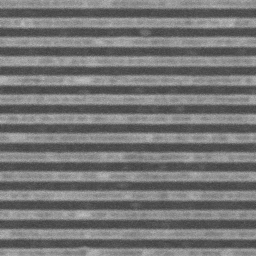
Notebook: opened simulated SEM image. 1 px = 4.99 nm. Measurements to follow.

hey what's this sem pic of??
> parallel lines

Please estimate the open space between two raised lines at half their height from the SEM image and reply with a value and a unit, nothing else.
54.3 nm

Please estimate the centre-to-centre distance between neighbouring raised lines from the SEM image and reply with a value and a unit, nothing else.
95.7 nm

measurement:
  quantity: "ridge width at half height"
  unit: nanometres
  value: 39.9